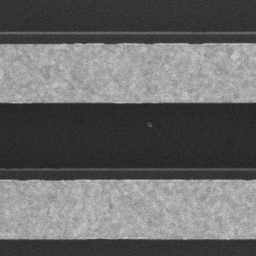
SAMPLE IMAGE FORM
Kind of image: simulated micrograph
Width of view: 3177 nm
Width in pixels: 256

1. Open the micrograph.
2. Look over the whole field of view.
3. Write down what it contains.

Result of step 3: lines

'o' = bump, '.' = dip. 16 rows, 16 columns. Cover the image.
................
................
................
oooooooooooooooo
oooooooooooooooo
oooooooooooooooo
................
................
................
................
................
oooooooooooooooo
oooooooooooooooo
oooooooooooooooo
oooooooooooooooo
................